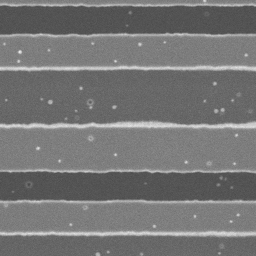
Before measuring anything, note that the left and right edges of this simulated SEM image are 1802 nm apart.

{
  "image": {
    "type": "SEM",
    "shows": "lines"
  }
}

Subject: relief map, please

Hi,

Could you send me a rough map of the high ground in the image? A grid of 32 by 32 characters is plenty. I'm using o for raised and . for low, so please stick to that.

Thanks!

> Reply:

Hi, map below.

oooooooooooooooooooooooooooooooo
................................
................................
................................
oooooooooooooooooooooooooooooooo
oooooooooooooooooooooooooooooooo
oooooooooooooooooooooooooooooooo
oooooooooooooooooooooooooooooooo
oooooo.ooo...o....o............o
................................
................................
................................
................................
................................
................................
................................
oooooooooooooooooooooooooooooooo
oooooooooooooooooooooooooooooooo
oooooooooooooooooooooooooooooooo
oooooooooooooooooooooooooooooooo
oooooooooooooooooooooooooooooooo
................................
................................
................................
................................
oooooooooooooooooooooooooooooooo
oooooooooooooooooooooooooooooooo
oooooooooooooooooooooooooooooooo
oooooooooooooooooooooooooooooooo
................................
................................
................................